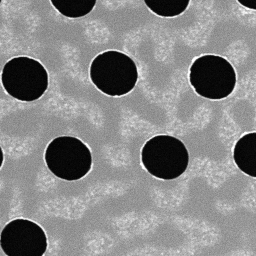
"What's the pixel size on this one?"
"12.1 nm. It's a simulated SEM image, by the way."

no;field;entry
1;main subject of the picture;holes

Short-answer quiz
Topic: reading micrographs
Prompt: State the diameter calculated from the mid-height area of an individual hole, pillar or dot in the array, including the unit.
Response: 554 nm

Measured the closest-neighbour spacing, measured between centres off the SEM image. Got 1.09 micrometres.